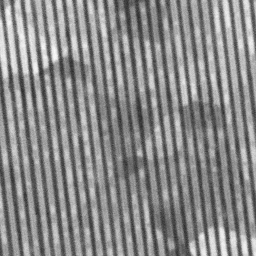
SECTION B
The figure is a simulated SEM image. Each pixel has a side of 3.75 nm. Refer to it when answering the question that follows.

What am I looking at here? parallel lines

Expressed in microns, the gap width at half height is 0.02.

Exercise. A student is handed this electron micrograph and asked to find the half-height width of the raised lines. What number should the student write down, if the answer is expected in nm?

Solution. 16.7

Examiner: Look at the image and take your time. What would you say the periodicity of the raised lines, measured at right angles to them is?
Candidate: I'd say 38.7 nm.